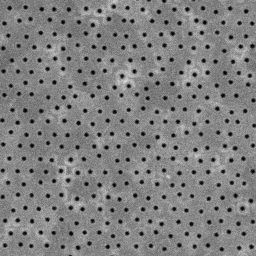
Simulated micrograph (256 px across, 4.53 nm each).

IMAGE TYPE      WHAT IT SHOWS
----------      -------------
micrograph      a regular array of holes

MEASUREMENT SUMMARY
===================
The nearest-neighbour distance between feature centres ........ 12.2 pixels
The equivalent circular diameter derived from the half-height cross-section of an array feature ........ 21.7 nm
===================